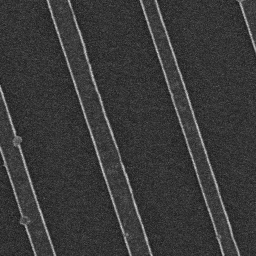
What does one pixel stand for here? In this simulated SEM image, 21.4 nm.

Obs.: one or a few lines or trenches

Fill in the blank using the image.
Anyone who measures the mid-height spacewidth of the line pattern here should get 1480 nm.